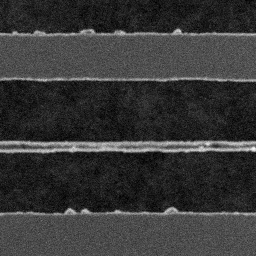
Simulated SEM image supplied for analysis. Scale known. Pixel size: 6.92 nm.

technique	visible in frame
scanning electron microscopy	lines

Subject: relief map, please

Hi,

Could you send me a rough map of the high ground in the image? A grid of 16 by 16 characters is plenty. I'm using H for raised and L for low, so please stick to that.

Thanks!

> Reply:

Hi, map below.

LLLLLLLLLLLLLLLL
LLLLLLLLLLLLLLLL
HHHHHHHHHHHHHHHH
HHHHHHHHHHHHHHHH
HHHHHHHHHHHHHHHH
LLLLLLLLLLLLLLLL
LLLLLLLLLLLLLLLL
LLLLLLLLLLLLLLLL
LLLLLLLLLLLLLLLL
LLLLLLLLLLLLLLLL
LLLLLLLLLLLLLLLL
LLLLLLLLLLLLLLLL
LLLLLLLLLLLLLLLL
HHHHHHHHHHHHHHHH
HHHHHHHHHHHHHHHH
HHHHHHHHHHHHHHHH